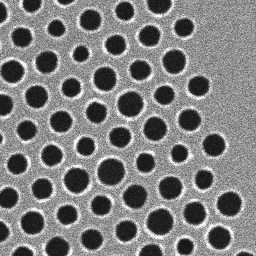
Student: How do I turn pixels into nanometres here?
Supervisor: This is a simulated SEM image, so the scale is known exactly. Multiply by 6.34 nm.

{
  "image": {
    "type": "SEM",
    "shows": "a regular array of holes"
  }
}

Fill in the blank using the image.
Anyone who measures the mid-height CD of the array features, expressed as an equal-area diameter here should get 131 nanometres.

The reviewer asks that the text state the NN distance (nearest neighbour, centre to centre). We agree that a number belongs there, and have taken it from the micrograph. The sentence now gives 0.221 µm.